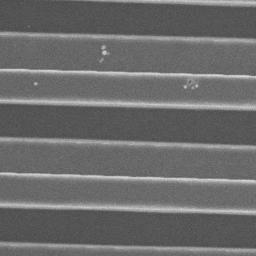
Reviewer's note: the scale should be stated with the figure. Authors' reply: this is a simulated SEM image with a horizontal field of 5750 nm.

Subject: lines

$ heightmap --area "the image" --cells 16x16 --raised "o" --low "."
................
................
oooooooooooo....
oooooooooooooooo
oooooooooooooooo
oooooooooooooooo
.......ooooooooo
................
................
oooooooooooooooo
oooooooooooooooo
oooooooooooooooo
oooooooooooooooo
................
................
oooooooo........